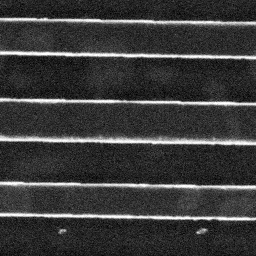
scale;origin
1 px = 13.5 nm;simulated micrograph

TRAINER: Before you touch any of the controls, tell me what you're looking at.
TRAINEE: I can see lines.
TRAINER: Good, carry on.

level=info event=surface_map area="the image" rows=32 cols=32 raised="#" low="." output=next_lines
................................
................................
###########.....................
################################
################################
################################
################################
................................
................................
................................
................................
................................
####............................
################################
################################
################################
################################
.....###########################
................................
................................
................................
................................
................................
################################
################################
################################
################################
................................
................................
................................
................................
................................